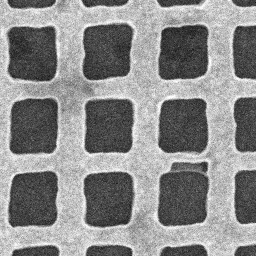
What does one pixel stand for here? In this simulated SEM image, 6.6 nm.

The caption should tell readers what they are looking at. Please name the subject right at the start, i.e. a regular array of holes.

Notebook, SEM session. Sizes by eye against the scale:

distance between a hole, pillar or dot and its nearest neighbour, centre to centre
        0.483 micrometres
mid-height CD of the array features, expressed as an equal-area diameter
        374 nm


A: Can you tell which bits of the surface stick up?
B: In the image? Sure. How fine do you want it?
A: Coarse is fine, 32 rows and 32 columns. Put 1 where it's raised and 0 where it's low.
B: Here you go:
10000001110000001111000001111000
11111111111111111111111111111111
11111111111111111111111111111111
10000001111000001111100000111100
10000001110000000111000000111000
10000001110000000111000000111000
10000001111000001111000000111000
10000001111000001111000000111000
10000001110000001111000000111000
10000001111000011111000001111100
11111111111111111111111111111111
11111111111111111111111111111111
11100001111000001111100001111100
10000001111000000111000000111000
10000001111000000111000000111000
10000001111000000111000000111000
10000001111000001111000000111000
10000001111000000111000000111000
10000001111000001111000000111100
11111111111111111111111111111111
11111111111111111111110000111111
11110001111111011111100000111100
11000001111000000111000000111000
10000001110000000111000000111000
10000001111000000111000000111000
10000001111000000111000000111000
10000001111000001111000000111000
10000001111000001111000000111100
11111111111111111111111111111111
11111111111111111111111111111111
11111111111111111111111111111111
11000001111000000111000000111000